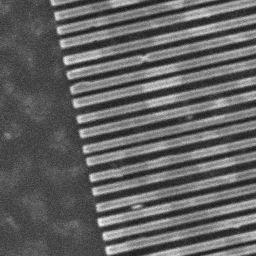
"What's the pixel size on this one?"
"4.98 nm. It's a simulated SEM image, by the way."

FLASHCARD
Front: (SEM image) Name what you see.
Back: parallel lines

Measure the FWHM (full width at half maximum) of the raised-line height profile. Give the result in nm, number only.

35.3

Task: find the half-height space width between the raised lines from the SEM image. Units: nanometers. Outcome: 39.5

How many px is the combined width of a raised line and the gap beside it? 15.1